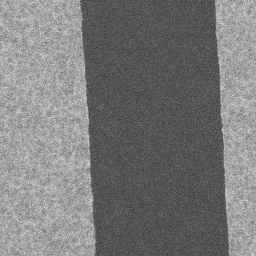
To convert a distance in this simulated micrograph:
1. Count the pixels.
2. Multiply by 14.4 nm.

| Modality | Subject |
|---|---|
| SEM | one or a few lines or trenches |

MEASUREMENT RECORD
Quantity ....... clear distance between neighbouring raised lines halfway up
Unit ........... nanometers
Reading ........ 1940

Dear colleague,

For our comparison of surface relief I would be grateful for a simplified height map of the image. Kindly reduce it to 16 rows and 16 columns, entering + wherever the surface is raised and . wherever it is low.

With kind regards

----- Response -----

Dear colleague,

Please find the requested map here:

+++++........+++
+++++.........++
+++++.........++
+++++.........++
+++++.........++
+++++.........++
+++++.........++
+++++.........++
++++++........++
++++++........++
++++++........++
++++++........++
++++++........++
++++++........++
++++++........++
++++++........++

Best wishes